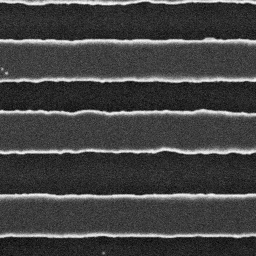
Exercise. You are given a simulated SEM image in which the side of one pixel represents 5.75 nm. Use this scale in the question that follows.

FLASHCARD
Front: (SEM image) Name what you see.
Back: lines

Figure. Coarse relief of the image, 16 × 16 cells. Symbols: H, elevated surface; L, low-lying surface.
LLLLLLLLLLLLLLLL
LLLLLLLLLLLLLLLL
HHHLLHHHHHHHLHHH
HHHHHHHHHHHHHHHH
HHHHHHHHHHHHHHHH
LLLLLLLLLLLLLLLL
LLLLLLLLLLLLLLLL
HHHHHHHHHHHHHHHH
HHHHHHHHHHHHHHHH
HHHHHLLHHLLHHHHH
LLLLLLLLLLLLLLLL
LLLLLLLLLLLLLLLL
HHHHHHHHHHHHHHHH
HHHHHHHHHHHHHHHH
HHHHHHHHHHHHHHHH
LLLLLLLLLLLLLLLL